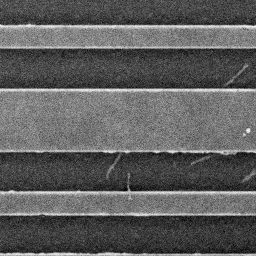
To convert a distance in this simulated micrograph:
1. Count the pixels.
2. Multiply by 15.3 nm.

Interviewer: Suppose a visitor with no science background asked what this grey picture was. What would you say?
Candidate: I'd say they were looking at lines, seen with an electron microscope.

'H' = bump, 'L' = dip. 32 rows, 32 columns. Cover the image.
LLLLLLLLLLLLLLLLLLLLLLLLLLLLLLLL
LLLLLLLLLLLLLLLLLLLLLLLLLLLLLLLL
LLLLLLLLLLLLLLLLLLLLLLLLLLLLLLLL
HHHHHHHHHHHHHHHHHHHHHHHHHHHHHHHH
HHHHHHHHHHHHHHHHHHHHHHHHHHHHHHHH
HHHHHHHHHHHHHHHHHHHHHHHHHHHHHHHH
LLLLLLLLLLLLLLLLLLLLLLLLLLLLLLLL
LLLLLLLLLLLLLLLLLLLLLLLLLLLLLLLL
LLLLLLLLLLLLLLLLLLLLLLLLLLLLLLLL
LLLLLLLLLLLLLLLLLLLLLLLLLLLLLLLL
LLLLLLLLLLLLLLLLLLLLLLLLLLLLLLLL
HHHHHHHHHHHHHHHHHHHHHHHHHHHHHHHH
HHHHHHHHHHHHHHHHHHHHHHHHHHHHHHHH
HHHHHHHHHHHHHHHHHHHHHHHHHHHHHHHH
HHHHHHHHHHHHHHHHHHHHHHHHHHHHHHHH
HHHHHHHHHHHHHHHHHHHHHHHHHHHHHHHH
HHHHHHHHHHHHHHHHHHHHHHHHHHHHHHHH
HHHHHHHHHHHHHHHHHHHHHHHHHHHHHHHH
HHHHHHHHHHHHHHHHHHHHHHHHHHHHHHHH
LLLLLLLLLLLLLLLLLLLLLLLLLLLLLLLL
LLLLLLLLLLLLLLLLLLLLLLLLLLLLLLLL
LLLLLLLLLLLLLLLLLLLLLLLLLLLLLLLL
LLLLLLLLLLLLLLLLLLLLLLLLLLLLLLLL
LLLLLLLLLLLLLLLLLLLLLLLLLLLLLLLL
HHHHHHHHHHHHHHHHHHHHHHHHHHHHHHHH
HHHHHHHHHHHHHHHHHHHHHHHHHHHHHHHH
HHHHHHHHHHHHHHHHHHHHHHHHHHHHHHHH
LLLLLLLLLLLLLLLLLLLLLLLLLLLLLLLL
LLLLLLLLLLLLLLLLLLLLLLLLLLLLLLLL
LLLLLLLLLLLLLLLLLLLLLLLLLLLLLLLL
LLLLLLLLLLLLLLLLLLLLLLLLLLLLLLLL
LLLLLLLLLLLLLLLLLLLLLLLLLLLLLLLL